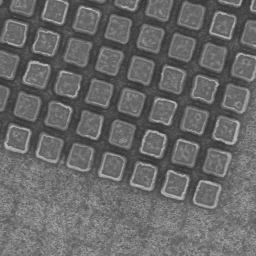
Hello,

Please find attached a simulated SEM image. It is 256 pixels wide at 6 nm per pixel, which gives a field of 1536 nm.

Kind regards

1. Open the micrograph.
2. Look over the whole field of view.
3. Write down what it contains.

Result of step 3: a regular array of raised bodies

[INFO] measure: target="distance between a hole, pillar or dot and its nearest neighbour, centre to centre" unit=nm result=196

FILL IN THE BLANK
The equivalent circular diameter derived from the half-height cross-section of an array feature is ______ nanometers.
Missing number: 157